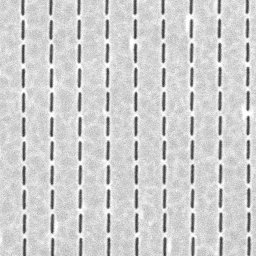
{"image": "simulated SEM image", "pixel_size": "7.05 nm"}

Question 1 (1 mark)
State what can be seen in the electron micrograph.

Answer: a regular array of holes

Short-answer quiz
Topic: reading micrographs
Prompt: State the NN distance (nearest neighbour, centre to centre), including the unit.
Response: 168 nanometers